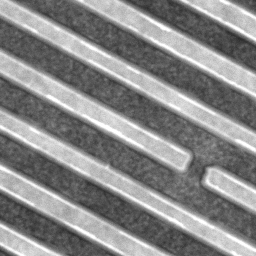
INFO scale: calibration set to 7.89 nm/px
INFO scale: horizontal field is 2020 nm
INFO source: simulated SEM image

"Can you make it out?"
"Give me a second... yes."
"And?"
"parallel lines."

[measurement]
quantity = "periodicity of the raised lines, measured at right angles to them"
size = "0.397 microns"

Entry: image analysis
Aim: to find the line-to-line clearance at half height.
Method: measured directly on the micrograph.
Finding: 238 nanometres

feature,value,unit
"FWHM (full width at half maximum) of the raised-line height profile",161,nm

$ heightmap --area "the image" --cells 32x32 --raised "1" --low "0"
11000000001111110000000111111000
11110000000011111100000001111110
01111100000000111111000000011111
00011111000000001111100000000111
00000111110000000011111000000001
00000001111000000001111110000000
00000000011110000000011111100000
11000000001111100000000111111000
11110000000011111000000001111110
01111100000000111110000000011111
00111111000000001111100000000111
00001111110000000011110000000011
00000011111000000001111100000000
00000000111110000000011111000000
11000000001111100000000111110000
11110000000011111000000001111100
11111000000001111110000000011111
00111110000000011111100000000111
00001111100000000111110000000001
00000011111000000001111100000000
00000000111110000000011000000000
11000000001111100000000000110000
11110000000111110000000000111100
11111100000001111100000000111111
01111110000000011111000000001111
00011111100000000111110000000011
00000111111000000001111100000000
00000001111110000000011111000000
11000000011111100000000111100000
11100000000111111000000011111000
11111000000011111100000000111110
01111110000000111111000000001111